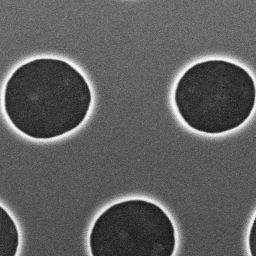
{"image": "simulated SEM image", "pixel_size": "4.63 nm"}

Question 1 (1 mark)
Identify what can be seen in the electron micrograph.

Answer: holes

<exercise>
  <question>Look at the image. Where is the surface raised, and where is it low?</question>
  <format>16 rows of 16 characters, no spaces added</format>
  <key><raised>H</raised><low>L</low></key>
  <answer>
HHHHHHHHHHHHHHHH
HHHHHHHHHHHHHHHH
HHHHHHHHHHHHHHHH
HHHHHHHHHHHHHHHH
HLLLLHHHHHHHLLLH
LLLLLLHHHHHLLLLL
LLLLLLHHHHHLLLLL
HLLLLHHHHHHLLLLH
HHLLHHHHHHHHHHHH
HHHHHHHHHHHHHHHH
HHHHHHHHHHHHHHHH
HHHHHHHHHHHHHHHH
HHHHHHHHLHHHHHHH
LHHHHHLLLLHHHHHH
LHHHHHLLLLLHHHHH
LHHHHHLLLLLHHHHH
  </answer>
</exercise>